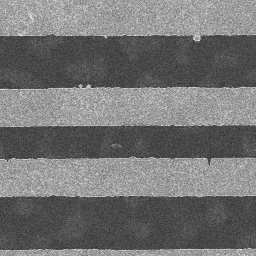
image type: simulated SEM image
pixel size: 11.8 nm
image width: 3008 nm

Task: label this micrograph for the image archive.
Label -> one or a few lines or trenches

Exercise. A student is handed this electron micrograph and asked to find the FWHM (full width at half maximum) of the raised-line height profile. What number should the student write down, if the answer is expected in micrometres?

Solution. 0.438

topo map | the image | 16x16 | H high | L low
HHHHHHHHHHHHHHHH
HHHHHHHHHHHHHHHH
LLLLLLLLLLLLLLLL
LLLLLLLLLLLLLLLL
LLLLLLLLLLLLLLLL
LLLLLHHHLHHHHHHH
HHHHHHHHHHHHHHHH
HHHHHHHHHHHHHHHH
LLLLLLLLLLLLLLLL
LLLLLLLLLLLLLLLL
HHHHHHHHHHHHHHHH
HHHHHHHHHHHHHHHH
LLLLLLLLLLLLLLLL
LLLLLLLLLLLLLLLL
LLLLLLLLLLLLLLLL
LLLLLLLLLLLLLLLH